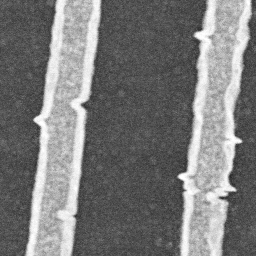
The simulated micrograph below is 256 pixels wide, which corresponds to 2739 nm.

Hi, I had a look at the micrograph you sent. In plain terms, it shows one or a few lines or trenches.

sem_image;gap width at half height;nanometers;1240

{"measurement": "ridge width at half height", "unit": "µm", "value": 0.367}